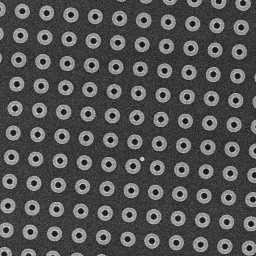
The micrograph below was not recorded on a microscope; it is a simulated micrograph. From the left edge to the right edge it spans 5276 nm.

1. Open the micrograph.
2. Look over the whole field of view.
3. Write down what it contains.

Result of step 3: an array of small figures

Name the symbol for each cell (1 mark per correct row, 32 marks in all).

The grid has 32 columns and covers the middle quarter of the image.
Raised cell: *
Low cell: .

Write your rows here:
***..****..****..****...**....**
**....**...****..****..****...**
..................**....***...**
..............................**
*...............................
**...***...***..................
**...***...***...***....**....*.
**...***...***...***...***...***
............*....***...***...***
..............................**
*...............................
**..***....**...................
**..****..****...***...**.......
*...****..****..****...***...***
...........**....***...***...***
.......................**....***
................................
*...***....**...................
*...***...***...***....**.......
*...***...***...***...****..***.
...........**...***...****..****
.......................**...***.
................................
*...**....**....................
*..****..****...***...**........
....***..****..****...***...***.
..........**....***...***...***.
......................**....***.
................................
...***....**....................
...***...***...***....**........
...***...***...****..****..***..